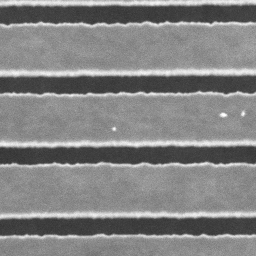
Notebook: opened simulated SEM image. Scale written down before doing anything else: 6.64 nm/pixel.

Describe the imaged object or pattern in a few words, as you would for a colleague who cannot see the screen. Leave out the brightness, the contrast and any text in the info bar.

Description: lines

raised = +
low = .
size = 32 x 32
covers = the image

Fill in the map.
++++++++++++++++++++++++++++++++
................................
................................
++++++++++++++++++++++++++++++++
++++++++++++++++++++++++++++++++
++++++++++++++++++++++++++++++++
++++++++++++++++++++++++++++++++
++++++++++++++++++++++++++++++++
++++++++++++++++++++++++++++++++
+++...++++......................
................................
................................
++++++++++++++++++++++++++++++++
++++++++++++++++++++++++++++++++
++++++++++++++++++++++++++++++++
++++++++++++++++++++++++++++++++
++++++++++++++++++++++++++++++++
++++++++++++++++++++++++++++++++
................................
................................
......+...+.++...++..++.+++..++.
++++++++++++++++++++++++++++++++
++++++++++++++++++++++++++++++++
++++++++++++++++++++++++++++++++
++++++++++++++++++++++++++++++++
++++++++++++++++++++++++++++++++
++++++++++++++++++++++++++++++++
................................
................................
.+++++++++.+++++++++++++.+.+++++
++++++++++++++++++++++++++++++++
++++++++++++++++++++++++++++++++